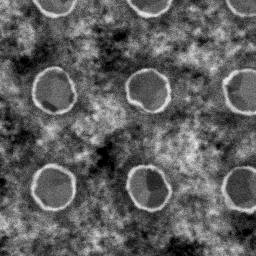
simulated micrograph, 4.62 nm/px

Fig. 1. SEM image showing raised bodies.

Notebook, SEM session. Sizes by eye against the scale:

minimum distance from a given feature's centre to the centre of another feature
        436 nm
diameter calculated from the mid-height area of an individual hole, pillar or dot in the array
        0.198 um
